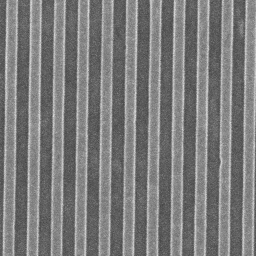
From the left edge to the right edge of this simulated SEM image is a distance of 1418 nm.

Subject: parallel lines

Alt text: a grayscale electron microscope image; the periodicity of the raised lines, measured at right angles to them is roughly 132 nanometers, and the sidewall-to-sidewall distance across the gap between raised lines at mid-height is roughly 73.4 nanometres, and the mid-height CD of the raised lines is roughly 58.2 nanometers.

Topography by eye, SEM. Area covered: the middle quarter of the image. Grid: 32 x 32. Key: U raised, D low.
DDDDUUDDDUUUDDDDUUDDDDUUDDDDUUDD
DDDDUUDDDUUUDDDDUUDDDDUUDDDDUUDD
DDDDUUDDDUUUDDDDUUDDDDUUDDDUUUDD
DDDDUUDDDUUUDDDDUUDDDDUUDDDUUUDD
DDDUUUDDDUUUDDDDUUDDDDUUDDDUUUDD
DDDUUUDDDUUUDDDDUUDDDDUUDDDUUUDD
DDDUUUDDDUUUDDDDUUDDDUUUDDDUUUDD
DDDUUUDDDUUUDDDDUUDDDUUUDDDUUUDD
DDDUUUDDDUUUDDDDUUDDDUUUDDDUUUDD
DDDUUUDDDUUUDDDDUUDDDUUUDDDUUUDD
DDDUUUDDDUUUDDDDUUDDDUUUDDDUUUDD
DDDUUUDDDUUUDDDUUUDDDUUUDDDUUUDD
DDDUUUDDDUUUDDDUUUDDDUUUDDDUUUDD
DDDUUUDDDUUUDDDUUUDDDUUUDDDUUUDD
DDDUUUDDDUUUDDDUUUDDDUUUDDDUUUDD
DDDUUUDDDUUUDDDUUUDDDUUUDDDUUUDD
DDDUUUDDDUUUDDDUUUDDDUUUDDDUUUDD
DDDUUUDDDUUUDDDUUUDDDUUUDDDUUUDD
DDDUUUDDDUUUDDDUUUDDDUUUDDDUUUDD
DDDUUUDDDUUUDDDUUUDDDUUDDDDUUUDD
DDDUUUDDDUUUDDDUUUDDDUUUDDDUUUDD
DDDUUUDDDUUUDDDUUUDDDUUDDDDUUUDD
DDDUUUDDDUUUDDDUUUDDDUUDDDDUUUDD
DDDUUUDDDUUUDDDUUDDDDUUDDDDUUUDD
DDDUUUDDDUUUDDDUUDDDDUUDDDDUUUDD
DDDUUUDDDUUUDDDUUDDDDUUDDDDUUUDD
DDDUUUDDDUUUDDDUUDDDDUUDDDDUUUDD
DDDUUUDDDUUUDDDUUDDDDUUDDDDUUUDD
DDDUUUDDDUUDDDDUUDDDDUUDDDDUUUDD
DDDUUUDDDUUDDDDUUDDDDUUDDDDUUUDD
DDDUUUDDDUUDDDDUUDDDDUUDDDDUUDDD
DDDUUUDDDUUDDDDUUDDDDUUDDDDUUDDD